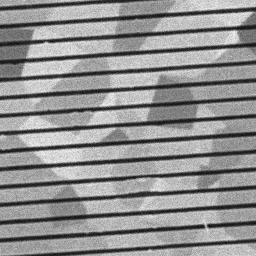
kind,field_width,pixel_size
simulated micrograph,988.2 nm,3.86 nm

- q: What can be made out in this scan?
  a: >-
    parallel lines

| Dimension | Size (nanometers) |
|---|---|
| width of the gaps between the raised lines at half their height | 19.2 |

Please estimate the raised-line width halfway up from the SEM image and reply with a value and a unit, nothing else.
51.4 nanometers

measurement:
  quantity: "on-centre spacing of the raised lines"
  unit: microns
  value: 0.0685